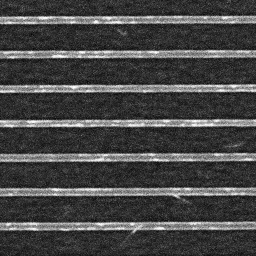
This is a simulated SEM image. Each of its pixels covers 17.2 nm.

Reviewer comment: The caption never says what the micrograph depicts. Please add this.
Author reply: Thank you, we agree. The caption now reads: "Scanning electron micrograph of parallel lines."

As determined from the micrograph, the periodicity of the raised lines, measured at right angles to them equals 592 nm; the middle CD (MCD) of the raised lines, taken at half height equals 103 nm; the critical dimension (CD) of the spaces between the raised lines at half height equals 487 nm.